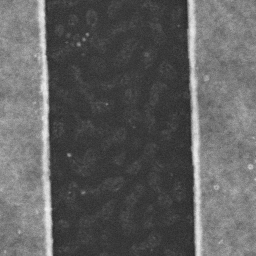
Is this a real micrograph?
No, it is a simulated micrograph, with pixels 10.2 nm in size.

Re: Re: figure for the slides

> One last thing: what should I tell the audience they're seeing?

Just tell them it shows one or a few lines or trenches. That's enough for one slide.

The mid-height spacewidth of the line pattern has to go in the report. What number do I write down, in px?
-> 150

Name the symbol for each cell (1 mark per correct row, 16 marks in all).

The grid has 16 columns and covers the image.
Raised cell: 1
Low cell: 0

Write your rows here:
1110000000001111
1110000000001111
1110000000001111
1110000000001111
1110000000001111
1110000000001111
1110000000001111
1110000000001111
1110000000001111
1110000000001111
1110000000001111
1110000000001111
1110000000001111
1110000000001111
1110000000001111
1110000000001111